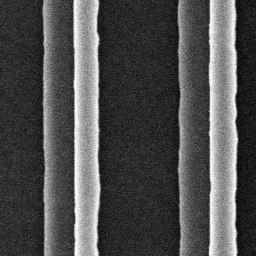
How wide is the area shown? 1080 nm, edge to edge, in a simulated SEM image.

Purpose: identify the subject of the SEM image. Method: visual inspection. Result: lines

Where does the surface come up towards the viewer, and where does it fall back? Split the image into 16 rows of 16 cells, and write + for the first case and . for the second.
...+++.....++++.
...+++.....++++.
...+++.....++++.
...+++.....++++.
...+++.....++++.
...+++.....++++.
...+++.....++++.
...+++.....++++.
...+++.....++++.
...+++.....++++.
...+++.....++++.
...+++.....++++.
...+++.....++++.
...+++.....++++.
...+++.....++++.
...+++.....++++.